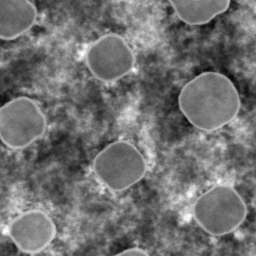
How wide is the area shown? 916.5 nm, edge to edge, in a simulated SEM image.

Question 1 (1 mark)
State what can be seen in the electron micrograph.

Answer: raised bodies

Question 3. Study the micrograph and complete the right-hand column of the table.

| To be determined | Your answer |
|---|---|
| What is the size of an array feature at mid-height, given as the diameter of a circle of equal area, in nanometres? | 177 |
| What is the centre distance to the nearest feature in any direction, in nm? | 389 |